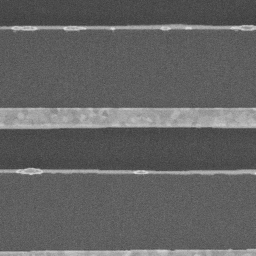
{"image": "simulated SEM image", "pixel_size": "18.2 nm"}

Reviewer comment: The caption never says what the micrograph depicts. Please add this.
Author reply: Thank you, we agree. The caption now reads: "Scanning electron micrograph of lines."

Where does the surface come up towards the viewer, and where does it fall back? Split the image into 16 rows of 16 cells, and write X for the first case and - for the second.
----------------
----------------
XXXXXXXXXXXXXXXX
XXXXXXXXXXXXXXXX
XXXXXXXXXXXXXXXX
XXXXXXXXXXXXXXXX
XXXXXXXXXXXXXXXX
XXXXXXXXXXXXXXXX
----------------
----------------
----------------
XXXXXXXXXXXXXXXX
XXXXXXXXXXXXXXXX
XXXXXXXXXXXXXXXX
XXXXXXXXXXXXXXXX
XXXXXXXXXXXXXXXX